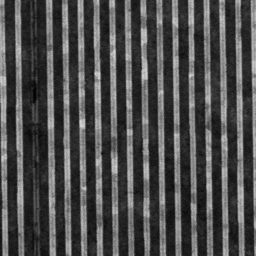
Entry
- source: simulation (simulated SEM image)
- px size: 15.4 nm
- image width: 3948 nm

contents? parallel lines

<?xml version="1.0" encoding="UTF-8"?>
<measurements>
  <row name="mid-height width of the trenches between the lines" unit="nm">179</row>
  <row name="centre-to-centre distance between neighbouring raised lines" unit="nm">242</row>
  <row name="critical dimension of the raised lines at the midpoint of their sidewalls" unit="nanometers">59.7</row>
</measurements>